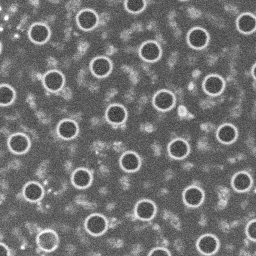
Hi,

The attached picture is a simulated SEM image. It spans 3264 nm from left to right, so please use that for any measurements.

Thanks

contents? a regular array of holes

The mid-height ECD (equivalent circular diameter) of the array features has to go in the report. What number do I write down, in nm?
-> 237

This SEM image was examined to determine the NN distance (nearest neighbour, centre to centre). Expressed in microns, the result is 0.634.